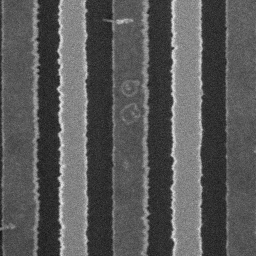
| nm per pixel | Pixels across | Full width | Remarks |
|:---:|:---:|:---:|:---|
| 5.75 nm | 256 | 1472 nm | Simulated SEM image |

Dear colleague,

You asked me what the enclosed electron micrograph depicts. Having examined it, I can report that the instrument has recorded lines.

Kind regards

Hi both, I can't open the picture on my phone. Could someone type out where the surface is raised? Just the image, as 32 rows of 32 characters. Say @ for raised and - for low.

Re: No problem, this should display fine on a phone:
@@@@@--@@@@---@@@@---@@@@---@@@@
@@@@@--@@@@---@@@@---@@@@---@@@@
@@@@@--@@@@---@@@@---@@@@---@@@@
@@@@@--@@@@---@@@@---@@@@---@@@@
@@@@@---@@@---@@@@----@@@---@@@@
@@@@@--@@@@---@@@@---@@@@---@@@@
@@@@@--@@@@---@@@@@---@@@---@@@@
@@@@@--@@@@---@@@@@---@@@---@@@@
@@@@@--@@@@---@@@@---@@@@---@@@@
@@@@@--@@@@---@@@@----@@@---@@@@
@@@@@---@@@---@@@@---@@@@---@@@@
@@@@@--@@@@---@@@@@--@@@@---@@@@
@@@@@--@@@@---@@@@----@@@---@@@@
@@@@@--@@@@---@@@@@--@@@@---@@@@
@@@@@--@@@@---@@@@----@@@---@@@@
@@@@@--@@@@---@@@@---@@@@---@@@@
@@@@@--@@@@---@@@@----@@@---@@@@
@@@@@---@@@---@@@@----@@@---@@@@
@@@@@---@@@---@@@@----@@@---@@@@
@@@@@---@@@---@@@@---@@@@---@@@@
@@@@@---@@@---@@@@----@@@---@@@@
@@@@@---@@@---@@@@@---@@@---@@@@
@@@@@--@@@@---@@@@----@@@---@@@@
@@@@@--@@@@---@@@@---@@@@---@@@@
@@@@@--@@@@---@@@@----@@@---@@@@
@@@@@--@@@@---@@@@---@@@@---@@@@
@@@@@--@@@@---@@@@@---@@@---@@@@
@@@@@--@@@@---@@@@---@@@@---@@@@
@@@@@---@@@---@@@@----@@@---@@@@
@@@@@---@@@---@@@@---@@@@---@@@@
@@@@@---@@@---@@@@----@@@---@@@@
@@@@@---@@@---@@@@----@@@---@@@@